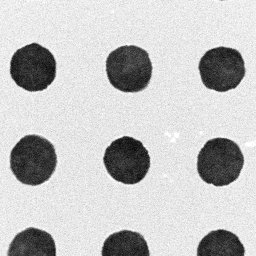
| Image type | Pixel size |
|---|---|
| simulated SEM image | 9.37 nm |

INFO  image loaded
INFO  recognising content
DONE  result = holes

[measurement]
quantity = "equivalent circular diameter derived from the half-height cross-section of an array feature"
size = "446 nm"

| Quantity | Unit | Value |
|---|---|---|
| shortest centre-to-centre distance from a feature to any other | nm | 866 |